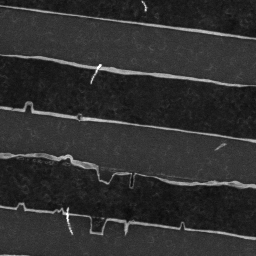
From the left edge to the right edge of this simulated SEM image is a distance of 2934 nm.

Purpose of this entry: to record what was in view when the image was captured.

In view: one or a few lines or trenches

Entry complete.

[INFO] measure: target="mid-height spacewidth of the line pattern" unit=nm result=550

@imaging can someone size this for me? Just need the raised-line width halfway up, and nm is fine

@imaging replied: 598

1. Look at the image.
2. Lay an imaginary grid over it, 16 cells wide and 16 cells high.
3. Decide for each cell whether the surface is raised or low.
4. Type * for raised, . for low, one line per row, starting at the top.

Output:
.***************
.........*******
................
*...............
********........
****************
****************
......**********
..............**
................
******..........
************.**.
****************
.....***********
.............***
................